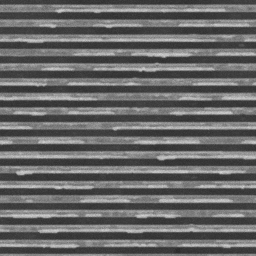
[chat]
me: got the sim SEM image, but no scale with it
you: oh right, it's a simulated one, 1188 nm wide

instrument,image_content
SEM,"parallel lines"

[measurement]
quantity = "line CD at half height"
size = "32.5 nanometers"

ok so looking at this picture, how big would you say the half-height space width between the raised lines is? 0.0372 micrometres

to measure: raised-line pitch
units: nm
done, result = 68.2